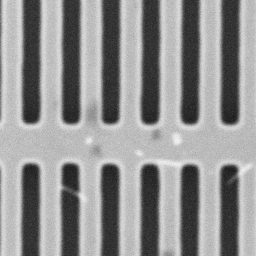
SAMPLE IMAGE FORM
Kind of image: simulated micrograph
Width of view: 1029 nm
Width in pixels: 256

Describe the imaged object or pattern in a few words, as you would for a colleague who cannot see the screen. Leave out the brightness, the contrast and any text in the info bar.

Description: groups of lines, slits or small figures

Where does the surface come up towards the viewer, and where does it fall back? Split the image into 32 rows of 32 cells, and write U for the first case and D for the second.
UUUDDUUUDDUUUDDUUUDDUUUDDUUDDDUU
UUUDDUUUDDUUUDDUUUDDUUUDDUUDDDUU
UUUDDUUUDDUUUDDUUUDDUUUDDUUDDDUU
UUUDDUUUDDUUUDDUUUDDUUUDDUUDDDUU
UUUDDUUUDDUUUDDUUUDDUUUDDUUDDDUU
UUUDDUUUDDUUUDDUUUDDUUUDDUUDDDUU
UUUDDUUUDDUUUDDUUUDDUUUDDUUDDDUU
UUUDDUUUDDUUUDDUUUDDUUUDDUUDDDUU
UUUDDUUUDDUUUDDUUUDDUUUDDUUDDDUU
UUUDDUUUDDUUUDDUUUDDUUUDDUUDDDUU
UUUDDUUUDDUUUDDUUUDDUUUDDUUDDDUU
UUUDDUUUDDUUUDDUUUDDUUUDDUUDDDUU
UUUDDUUUDDUUUDDUUDDDUUUDDUUDDDUU
UUUDDUUUDDUUUDDUUDDDUUUDDUUDDDUU
UUUDDUUUDDUUUDDUUUDDUUUDDUUDDDUU
UUUDDUUUDDUUUDUUUUDDUUUDDUUUDDUU
UUUUUUUUUUUUUUUUUUUUUUUUUUUUUUUU
UUUUUUUUUUUUUUUUUUUUUUUUUUUUUUUU
UUUUUUUUUUUUUUUUUUUUUUUUUUUUUUUU
UUUUUUUUUUUUUUUUUUUUUUUUUUUUUUUU
UUUDDUUUDUUUUDUUUUDUUUUDUUUUUUUU
UUUDDUUUDDUUDDDUUUDDUUUDDUUDDDUU
UUUDDUUUDDUUDDDUUDDDUUUDDUUDDDUU
UUUDDUUUDDUUDDDUUDDDUUDDDUUDDDUU
UUUDDUUDDDUUUDDUUDDDUUDDDUUDDDUU
UUUDDUUDDDUUUDDUUDDDUUDDDUUDDDUU
UUUDDUUDDDUUDDDUUDDDUUDDDUUDDDUU
UUUDDUUDDDUUDDDUUDDDUUDDDUUDDDUU
UUUDDUUDDDUUUDDUUDDDUUDDDUUDDDUU
UUUDDUUDDDUUUDDUUDDDUUDDDUUDDDUU
UUUDDUUDDDUUUDDUUDDDUUDDDUUDDDUU
UUUDDUUDDDUUDDDUUDDDUUDDDUUDDDUU